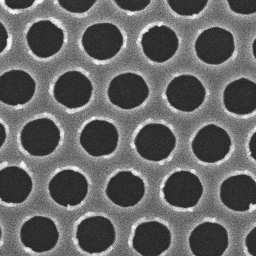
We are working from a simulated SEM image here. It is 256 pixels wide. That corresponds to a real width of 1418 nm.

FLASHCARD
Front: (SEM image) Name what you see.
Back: a regular array of holes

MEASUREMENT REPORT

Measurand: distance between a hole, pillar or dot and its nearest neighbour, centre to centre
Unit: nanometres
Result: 304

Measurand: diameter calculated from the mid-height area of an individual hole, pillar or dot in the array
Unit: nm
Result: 209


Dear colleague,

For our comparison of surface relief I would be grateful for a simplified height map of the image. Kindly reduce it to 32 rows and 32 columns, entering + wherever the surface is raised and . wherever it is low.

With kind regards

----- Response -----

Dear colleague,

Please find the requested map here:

+...++++....+++....++.....+++...
+++++++++.++++++++++++...++++...
++++++++++++++++++++++++++++++++
.+++...++++....++++..+++++.+++++
.++.....++.....+++....+++....+++
.+++....++.....+++....++.....+++
++++...++++....+++....++.....+++
+++++++++++++++++++..++++...++++
++++++++++++++++++++++++++++++++
....++++...++++...+++++.++++++++
....+++....+++....+++....++++...
....+++....+++.....++.....++....
....+++....+++....+++....+++....
+++++++++.+++++..+++++...+++....
++++++++++++++++++++++++++++++++
+++....++++...+++++.++++++++++++
.++....+++.....++....++++...++++
.++....+++.....++.....++.....++.
+++....+++....+++.....++.....++.
++++.+++++++++++++...++++...++++
++++++++++++++++++++++++++++++++
...+++++..+++++.++++++..++++++++
....++.....+++....+++....+++....
....++.....++.....++.....+++....
...+++.....++.....+++....+++....
+++++++...+++++..++++....+++....
++++++++++++++++++++++++++++++++
++++..+++++..+++++++++++++++++++
+++....+++....+++....+++....++++
+++....+++....+++....+++....+++.
+++....+++....+++....+++....+++.
+++++++++++..++++...++++....+++.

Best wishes